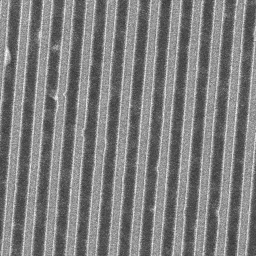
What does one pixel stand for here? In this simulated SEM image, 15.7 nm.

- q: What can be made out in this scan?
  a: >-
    parallel lines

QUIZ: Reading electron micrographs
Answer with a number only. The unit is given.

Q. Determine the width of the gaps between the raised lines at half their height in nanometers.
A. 125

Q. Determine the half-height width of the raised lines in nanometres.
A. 215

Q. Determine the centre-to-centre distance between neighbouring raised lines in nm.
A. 335